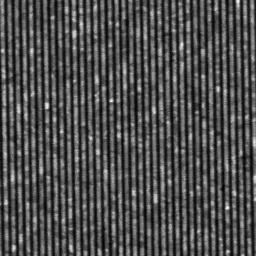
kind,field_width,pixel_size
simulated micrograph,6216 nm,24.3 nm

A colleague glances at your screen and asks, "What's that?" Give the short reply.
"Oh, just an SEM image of parallel lines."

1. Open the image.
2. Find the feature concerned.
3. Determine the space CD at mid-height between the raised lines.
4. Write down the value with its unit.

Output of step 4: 72.8 nanometers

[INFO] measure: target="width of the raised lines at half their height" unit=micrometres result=0.0941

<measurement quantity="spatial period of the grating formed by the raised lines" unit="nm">173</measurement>